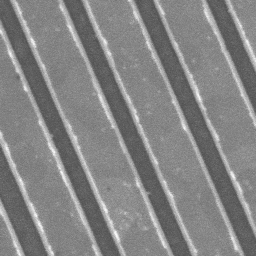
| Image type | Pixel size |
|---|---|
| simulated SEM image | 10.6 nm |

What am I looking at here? one or a few lines or trenches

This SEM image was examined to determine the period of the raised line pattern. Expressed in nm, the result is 696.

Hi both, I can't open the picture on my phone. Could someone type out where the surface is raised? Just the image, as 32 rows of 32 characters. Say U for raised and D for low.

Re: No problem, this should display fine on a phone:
DDUUUUUUDDDUUUUUUDDDUUUUUUDDDUUU
DDUUUUUUDDDUUUUUUDDDUUUUUUDDDUUU
DDDUUUUUUDDDUUUUUUDDUUUUUUUDDUUU
DDDUUUUUUDDDUUUUUUDDDUUUUUUDDDUU
UDDUUUUUUDDDUUUUUUDDDUUUUUUDDDUU
UDDDUUUUUUDDDUUUUUUDDDUUUUUUDDDU
UDDDUUUUUUDDDUUUUUUDDDUUUUUUDDDU
UUDDDUUUUUUDDDUUUUUUDDDUUUUUUDDD
UUDDDUUUUUUDDDUUUUUUDDDUUUUUUDDD
UUUDDDUUUUUUDDDUUUUUUDDUUUUUUUDD
UUUDDDUUUUUUDDDUUUUUUDDDUUUUUUDD
UUUUDDDUUUUUUDDUUUUUUDDDUUUUUUDD
UUUUDDDUUUUUUDDDUUUUUUDDDUUUUUUD
UUUUUDDUUUUUUDDDUUUUUUDDDUUUUUUD
UUUUUDDDUUUUUUDDDUUUUUUDDDUUUUUU
UUUUUDDDUUUUUUDDDUUUUUUDDDUUUUUU
UUUUUUDDDUUUUUUDDDUUUUUUDDUUUUUU
UUUUUUDDDUUUUUUDDDUUUUUUDDDUUUUU
DUUUUUUDDDUUUUUUDDUUUUUUUDDUUUUU
DUUUUUUDDDUUUUUUDDDUUUUUUDDDUUUU
DUUUUUUUDDUUUUUUDDDUUUUUUDDDUUUU
DDUUUUUUDDDUUUUUUDDDUUUUUUDDDUUU
DDUUUUUUDDDUUUUUUDDDUUUUUUDDDUUU
DDDUUUUUUDDDUUUUUUDDDUUUUUUDDDUU
DDDUUUUUUDDDUUUUUUDDDUUUUUUDDDUU
DDDDUUUUUUDDDUUUUUUDDDUUUUUUDDUU
UDDDUUUUUUDDDUUUUUUDDDUUUUUUDDDU
UDDDUUUUUUUDDUUUUUUDDDUUUUUUDDDU
UDDDDUUUUUUDDDUUUUUUDDDUUUUUUDDD
UUDDDUUUUUUDDDUUUUUUDDDUUUUUUDDD
UUDDDDUUUUUUDDDUUUUUUDDDUUUUUUDD
UUUDDDUUUUUUDDDUUUUUUDDDUUUUUUDD